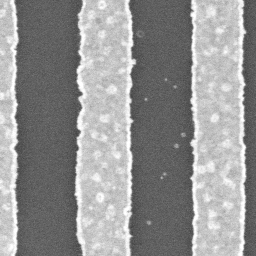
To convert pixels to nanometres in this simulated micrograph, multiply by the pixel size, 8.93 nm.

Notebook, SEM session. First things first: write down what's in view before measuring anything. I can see one or a few lines or trenches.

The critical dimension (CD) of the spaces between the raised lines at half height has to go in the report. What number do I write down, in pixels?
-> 63.8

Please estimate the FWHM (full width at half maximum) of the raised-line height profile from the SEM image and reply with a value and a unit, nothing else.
447 nm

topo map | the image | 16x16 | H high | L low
HLLLLHHHLLLLHHHL
HLLLLHHHLLLLHHHL
HLLLLHHHLLLLHHHL
HLLLLHHHLLLLHHHL
HLLLLHHHLLLLHHHL
HLLLLHHHLLLLHHHL
HLLLLHHHLLLLHHHL
HLLLLHHHLLLLHHHL
HLLLLHHHLLLLHHHL
HLLLLHHHLLLLHHHL
HLLLLHHHLLLLHHHL
HLLLLHHHLLLLHHHL
HLLLLHHHLLLLHHHL
HLLLLHHHLLLLHHHL
HLLLLHHHLLLLHHHL
HLLLLHHHLLLLHHHL